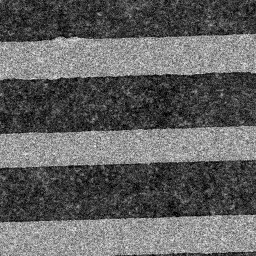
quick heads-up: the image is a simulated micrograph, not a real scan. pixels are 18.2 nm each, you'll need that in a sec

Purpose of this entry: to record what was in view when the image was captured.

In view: one or a few lines or trenches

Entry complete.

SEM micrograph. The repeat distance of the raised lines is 1620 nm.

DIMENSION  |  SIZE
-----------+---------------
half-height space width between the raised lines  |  1.01 microns